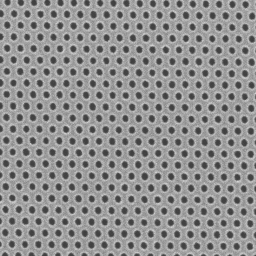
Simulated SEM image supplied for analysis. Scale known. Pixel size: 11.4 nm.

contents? a regular array of holes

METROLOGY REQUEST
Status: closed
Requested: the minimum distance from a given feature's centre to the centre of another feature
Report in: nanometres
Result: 148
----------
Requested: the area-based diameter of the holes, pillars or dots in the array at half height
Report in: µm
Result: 0.08